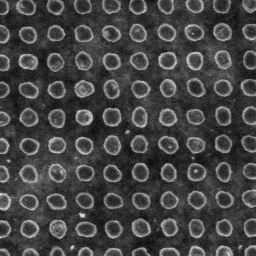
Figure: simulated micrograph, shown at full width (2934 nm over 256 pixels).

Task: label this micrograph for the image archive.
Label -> a regular array of raised bodies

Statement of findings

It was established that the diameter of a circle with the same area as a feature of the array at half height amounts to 0.194 micrometres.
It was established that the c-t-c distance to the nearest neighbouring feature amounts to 312 nanometres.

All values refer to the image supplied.